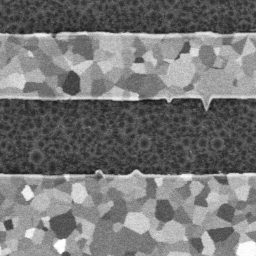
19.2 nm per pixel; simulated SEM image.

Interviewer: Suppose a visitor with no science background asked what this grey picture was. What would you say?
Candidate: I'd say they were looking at one or a few lines or trenches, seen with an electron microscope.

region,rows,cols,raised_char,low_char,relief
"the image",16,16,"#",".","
................
................
################
################
################
################
................
................
................
................
................
################
################
################
################
################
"